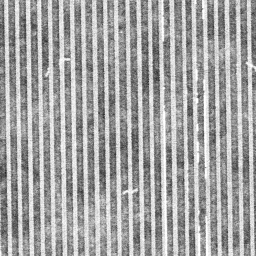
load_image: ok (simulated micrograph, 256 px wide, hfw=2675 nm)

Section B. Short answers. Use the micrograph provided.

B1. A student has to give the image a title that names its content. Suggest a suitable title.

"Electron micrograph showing parallel lines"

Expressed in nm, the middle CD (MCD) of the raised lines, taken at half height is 37.9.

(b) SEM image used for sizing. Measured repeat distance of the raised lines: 11 pixels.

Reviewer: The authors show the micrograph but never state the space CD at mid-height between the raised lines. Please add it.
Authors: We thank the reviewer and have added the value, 0.0745 µm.